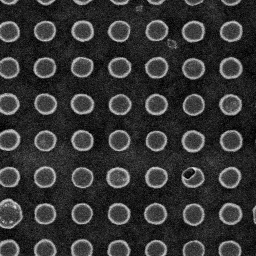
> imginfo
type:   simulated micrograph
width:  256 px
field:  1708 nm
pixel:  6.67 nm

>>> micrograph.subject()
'a regular array of raised bodies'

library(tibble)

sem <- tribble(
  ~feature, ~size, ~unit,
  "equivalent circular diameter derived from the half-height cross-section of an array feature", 20.8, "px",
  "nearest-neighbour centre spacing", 0.242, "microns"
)